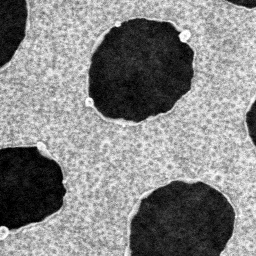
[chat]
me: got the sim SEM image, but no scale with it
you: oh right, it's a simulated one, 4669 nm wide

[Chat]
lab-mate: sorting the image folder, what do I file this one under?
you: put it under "holes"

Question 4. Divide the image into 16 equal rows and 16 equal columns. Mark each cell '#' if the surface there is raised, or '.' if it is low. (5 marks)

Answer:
..##############
..######...#####
.#####.....#####
.#####......####
######......####
#####.......####
######.....#####
#######..######.
################
...#############
....############
....######...###
....#####.....##
...#####.......#
########.......#
########......##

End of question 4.